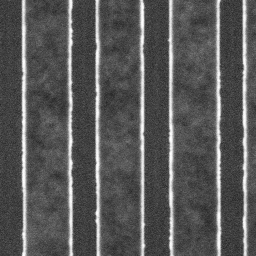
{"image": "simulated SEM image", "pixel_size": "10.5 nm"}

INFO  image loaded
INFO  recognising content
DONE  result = lines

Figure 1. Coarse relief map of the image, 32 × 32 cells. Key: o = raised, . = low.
...oooooo...oooooo...oooooo...oo
...oooooo...oooooo...oooooo...oo
...oooooo...oooooo...oooooo...oo
...oooooo...oooooo...oooooo...oo
...oooooo...oooooo...oooooo...oo
...oooooo...oooooo...oooooo...oo
...oooooo...oooooo...oooooo...oo
...oooooo...oooooo...oooooo...oo
...oooooo...oooooo...oooooo...oo
...oooooo...oooooo...oooooo...oo
...oooooo...oooooo...oooooo...oo
...oooooo...oooooo...oooooo...oo
...oooooo...oooooo...oooooo...oo
...oooooo...oooooo...oooooo...oo
...oooooo...oooooo...oooooo...oo
...oooooo...oooooo...oooooo...oo
...oooooo...oooooo...oooooo....o
...oooooo...oooooo...oooooo...oo
...oooooo...oooooo...oooooo...oo
...oooooo...oooooo...oooooo....o
...oooooo...oooooo...oooooo...oo
...oooooo...oooooo...oooooo...oo
...oooooo...oooooo...oooooo...oo
...oooooo...oooooo...oooooo...oo
...oooooo...oooooo...oooooo....o
...oooooo...oooooo...oooooo....o
...oooooo...oooooo...oooooo....o
...oooooo...oooooo...oooooo...oo
...oooooo...oooooo...oooooo...oo
...oooooo...oooooo...oooooo....o
...oooooo...oooooo...oooooo....o
...oooooo...oooooo...oooooo....o